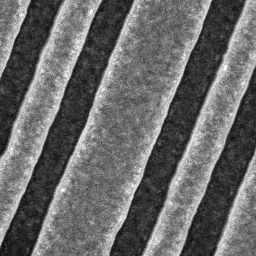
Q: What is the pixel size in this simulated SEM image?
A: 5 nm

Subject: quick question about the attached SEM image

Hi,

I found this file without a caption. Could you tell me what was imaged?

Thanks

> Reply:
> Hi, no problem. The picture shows lines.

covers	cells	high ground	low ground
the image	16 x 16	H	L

HHLLHHLLHHHHHLLH
HLLHHHLLHHHHHLLH
HLLHHLLHHHHHLLHH
HLLHHLLHHHHHLLHH
LLHHLLLHHHHLLLHH
LLHHLLHHHHHLLHHL
LHHHLLHHHHHLLHHL
LHHLLLHHHHLLHHHL
LHHLLHHHHHLLHHLL
HHHLLHHHHLLLHHLL
HHLLHHHHHLLHHLLL
HHLLHHHHHLLHHLLH
HLLHHHHHLLHHHLLH
HLLHHHHHLLHHLLHH
LLLHHHHLLLHHLLHH
LLHHHHHLLHHLLLHH